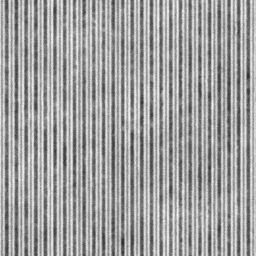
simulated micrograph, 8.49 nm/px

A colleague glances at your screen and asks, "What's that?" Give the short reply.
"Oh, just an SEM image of parallel lines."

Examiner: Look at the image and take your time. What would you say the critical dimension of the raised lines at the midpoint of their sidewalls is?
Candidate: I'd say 41.4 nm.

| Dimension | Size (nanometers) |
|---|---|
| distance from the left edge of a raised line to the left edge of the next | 82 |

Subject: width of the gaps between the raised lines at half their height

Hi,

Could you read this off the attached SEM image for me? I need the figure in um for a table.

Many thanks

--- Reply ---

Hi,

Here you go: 0.0414